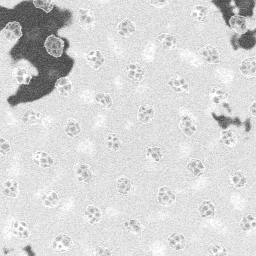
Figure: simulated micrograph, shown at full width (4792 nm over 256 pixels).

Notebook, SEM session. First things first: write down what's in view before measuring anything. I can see a regular array of raised bodies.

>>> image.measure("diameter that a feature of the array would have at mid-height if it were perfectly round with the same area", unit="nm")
309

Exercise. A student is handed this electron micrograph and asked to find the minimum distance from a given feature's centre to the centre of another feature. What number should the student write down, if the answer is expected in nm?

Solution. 785